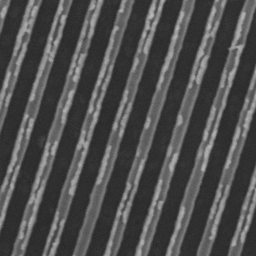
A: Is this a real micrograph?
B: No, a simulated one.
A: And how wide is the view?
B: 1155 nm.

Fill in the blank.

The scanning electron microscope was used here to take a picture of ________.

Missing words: parallel lines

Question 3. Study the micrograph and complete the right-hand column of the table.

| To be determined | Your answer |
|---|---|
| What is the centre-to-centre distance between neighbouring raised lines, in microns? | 0.133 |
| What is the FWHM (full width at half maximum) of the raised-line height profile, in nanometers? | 51.7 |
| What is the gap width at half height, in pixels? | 18.4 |